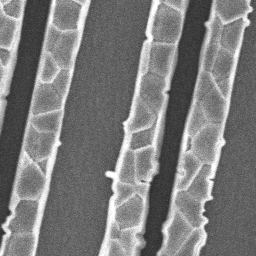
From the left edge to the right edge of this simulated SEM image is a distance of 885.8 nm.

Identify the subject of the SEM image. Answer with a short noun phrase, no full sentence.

one or a few lines or trenches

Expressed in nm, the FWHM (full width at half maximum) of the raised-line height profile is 120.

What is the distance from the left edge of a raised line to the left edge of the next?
271 nanometres